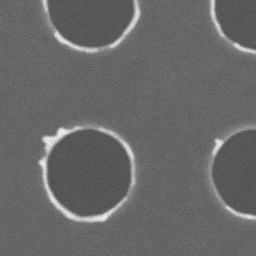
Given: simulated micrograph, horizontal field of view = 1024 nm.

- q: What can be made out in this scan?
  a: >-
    holes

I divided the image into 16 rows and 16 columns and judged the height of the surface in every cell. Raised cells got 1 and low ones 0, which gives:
1110000011111000
1110000011111100
1111000111111100
1111111111111111
1111111111111111
1111111111111111
1111111111111111
1111111111111111
1111000111111110
1110000011111100
1110000011111000
1110000011111000
1111000011111100
1111101111111111
1111111111111111
1111111111111111